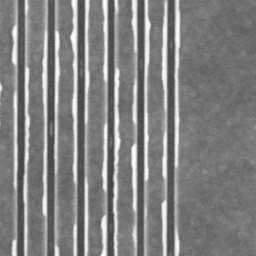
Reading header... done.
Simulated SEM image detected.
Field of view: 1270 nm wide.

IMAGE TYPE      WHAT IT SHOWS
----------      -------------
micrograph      parallel lines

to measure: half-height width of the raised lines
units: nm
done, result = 109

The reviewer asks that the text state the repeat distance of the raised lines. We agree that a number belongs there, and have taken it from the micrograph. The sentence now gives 149 nm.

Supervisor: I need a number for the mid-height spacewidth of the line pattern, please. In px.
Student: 7.38